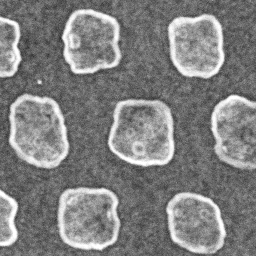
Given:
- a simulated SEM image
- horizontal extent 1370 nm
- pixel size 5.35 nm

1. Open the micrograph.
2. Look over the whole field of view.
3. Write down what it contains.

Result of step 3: raised bodies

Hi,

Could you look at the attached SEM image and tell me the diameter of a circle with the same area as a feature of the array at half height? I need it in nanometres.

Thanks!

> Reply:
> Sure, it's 315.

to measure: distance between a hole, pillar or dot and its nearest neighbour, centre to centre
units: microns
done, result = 0.545